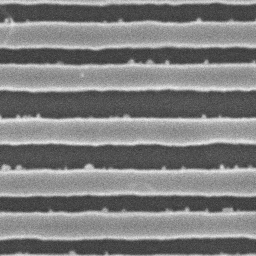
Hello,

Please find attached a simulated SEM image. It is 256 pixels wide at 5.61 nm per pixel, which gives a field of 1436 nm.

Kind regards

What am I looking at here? lines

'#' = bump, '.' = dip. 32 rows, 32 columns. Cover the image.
.........####........#..........
................................
................................
################################
################################
################################
................................
................................
################################
################################
################################
................................
................................
................................
................................
################################
################################
################################
................................
................................
................................
################################
################################
################################
.###............................
................................
.......................#....#...
################################
################################
################################
................................
................................